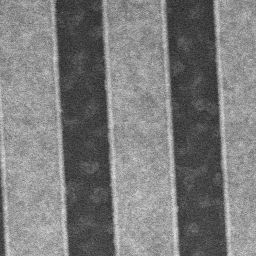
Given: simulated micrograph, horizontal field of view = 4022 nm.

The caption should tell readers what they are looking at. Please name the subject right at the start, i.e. one or a few lines or trenches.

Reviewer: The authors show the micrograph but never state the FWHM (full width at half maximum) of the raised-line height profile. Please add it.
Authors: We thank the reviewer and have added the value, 892 nm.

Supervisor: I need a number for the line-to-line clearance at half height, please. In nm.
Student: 847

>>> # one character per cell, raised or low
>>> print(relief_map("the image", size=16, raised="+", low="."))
+++....+++....++
+++....+++....++
+++....+++....++
+++....+++....++
+++....+++....++
+++....+++....++
++++...+++....++
++++...++++...++
++++...++++...++
++++...++++...++
++++...++++...++
++++...++++...++
++++...++++...++
++++...++++...++
++++...++++...++
.+++...++++...++